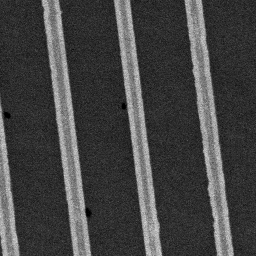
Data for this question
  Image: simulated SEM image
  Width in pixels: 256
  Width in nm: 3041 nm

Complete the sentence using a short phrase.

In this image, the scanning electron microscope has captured one or a few lines or trenches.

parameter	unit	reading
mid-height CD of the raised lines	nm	140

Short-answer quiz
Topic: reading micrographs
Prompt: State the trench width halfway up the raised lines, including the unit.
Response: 706 nm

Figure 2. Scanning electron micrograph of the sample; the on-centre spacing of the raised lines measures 0.841 µm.